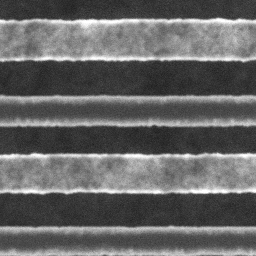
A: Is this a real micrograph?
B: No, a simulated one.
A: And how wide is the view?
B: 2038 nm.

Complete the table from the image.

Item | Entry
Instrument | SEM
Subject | lines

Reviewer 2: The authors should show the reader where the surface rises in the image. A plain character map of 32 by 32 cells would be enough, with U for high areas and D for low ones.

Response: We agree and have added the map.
DDDDDDDDDDDDDDDDDDDDDDDDDDDDDDDD
DDDDDDDDDDDDDDDDDDDDDDDDDDDDDDDD
DDDDUUDDDDDDDDDUUUUUUDUUUDUUDDUD
UUUUUUUUUUUUUUUUUUUUUUUUUUUUUUUU
UUUUUUUUUUUUUUUUUUUUUUUUUUUUUUUU
UUUUUUUUUUUUUUUUUUUUUUUUUUUUUUUU
UUUUUUUUUUUUUUUUUUUUUUUUUUUUUUUU
UUUDUDDUDUUDDUUUDUUDDDDDDUUUUUUD
DDDDDDDDDDDDDDDDDDDDDDDDDDDDDDDD
DDDDDDDDDDDDDDDDDDDDDDDDDDDDDDDD
DDDDDDDDDDDDDDDDDDDDDDDDDDDDDDDD
DDDDDDDDDDDDDDDDDDDDDDDDDDDDDDDD
UUUUUUUUUUUUUUUUUUUUUUUUUUUUUUUU
UUUUUUUUUUUUUUUUUUUUUUUUUUUUUUUU
UUUUUUUUUUUUUUUUUUUUUUUUUUUUUUUU
DDDDDDDDDDDDDDDUDDDDDDDDDDDDDDDD
DDDDDDDDDDDDDDDDDDDDDDDDDDDDDDDD
DDDDDDDDDDDDDDDDDDDDDDDDDDDDDDDD
DDDDDDDDDDDDDDDDDDDDDDDDDDDDDDDD
UUUUUUUUUUUUUUUUUUUUUUUUUUUUUUUU
UUUUUUUUUUUUUUUUUUUUUUUUUUUUUUUU
UUUUUUUUUUUUUUUUUUUUUUUUUUUUUUUU
UUUUUUUUUUUUUUUUUUUUUUUUUUUUUUUU
UUUUUUUUUUUUUUUUUUUUUUUUUUUUUUUU
DDDDDDDDDDDDDDDDDDDDDDDDDDDDDDDD
DDDDDDDDDDDDDDDDDDDDDDDDDDDDDDDD
DDDDDDDDDDDDDDDDDDDDDDDDDDDDDDDD
DDDDDDDDDDDDDDDDDDDDDDDDDDDDDDDD
DDDDDDDDDDDDDDDDDDDDDDDDDDDDDDDD
UUUUUUUUUUUUUUUUUUUUUUUUUUUUUUUU
UUUUUUUUUUUUUUUUUUUUUUUUUUUUUUUU
UUUUUUUUUUUUUUUUUUUUUUUUUUUUUUUU